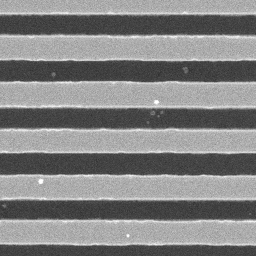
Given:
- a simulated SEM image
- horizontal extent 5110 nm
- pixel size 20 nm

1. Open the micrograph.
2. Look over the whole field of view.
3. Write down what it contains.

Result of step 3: lines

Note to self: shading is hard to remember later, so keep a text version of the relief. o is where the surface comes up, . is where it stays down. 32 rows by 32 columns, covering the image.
oooooooooooooooooooooooooooooooo
oooooooooooooooooooooooooooooooo
................................
................................
o......o........................
oooooooooooooooooooooooooooooooo
oooooooooooooooooooooooooooooooo
...ooooooooooo...ooooooooooooo.o
................................
................................
oooooooooooooooooooooooooooooooo
oooooooooooooooooooooooooooooooo
oooooooooooooooooooooooooooooooo
................................
................................
................................
oooooooooooooooooooooooooooooooo
oooooooooooooooooooooooooooooooo
oooooooooooooooooooooooooooooooo
................................
................................
................................
oooooooooooooooooooooooooooooooo
oooooooooooooooooooooooooooooooo
oooooooooooooooooooooooooooooooo
................................
................................
................................
oooooooooooooooooooooooooooooooo
oooooooooooooooooooooooooooooooo
.........ooooooo..ooo.....oooooo
................................